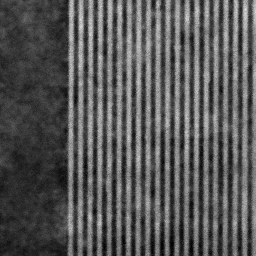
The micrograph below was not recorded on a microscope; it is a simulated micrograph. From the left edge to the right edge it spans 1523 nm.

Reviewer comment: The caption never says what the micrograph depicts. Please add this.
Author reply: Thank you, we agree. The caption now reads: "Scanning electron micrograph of parallel lines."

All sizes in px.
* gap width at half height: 6.12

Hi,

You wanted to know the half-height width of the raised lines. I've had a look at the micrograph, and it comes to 21.6 nanometres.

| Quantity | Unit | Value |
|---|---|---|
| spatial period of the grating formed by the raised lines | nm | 57.4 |